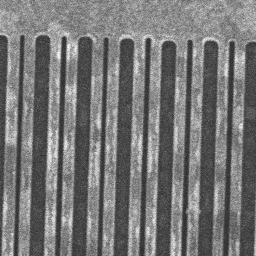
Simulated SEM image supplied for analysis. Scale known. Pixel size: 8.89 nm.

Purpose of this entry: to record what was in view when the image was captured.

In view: parallel lines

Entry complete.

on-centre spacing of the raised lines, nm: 183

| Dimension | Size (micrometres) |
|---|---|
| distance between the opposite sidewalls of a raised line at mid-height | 0.0933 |